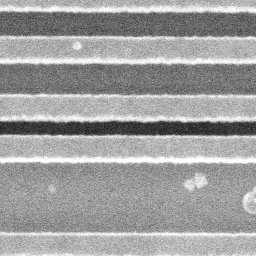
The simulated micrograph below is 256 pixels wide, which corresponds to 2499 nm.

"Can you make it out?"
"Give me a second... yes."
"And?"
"lines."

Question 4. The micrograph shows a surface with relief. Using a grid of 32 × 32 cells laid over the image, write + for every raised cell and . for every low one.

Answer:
++++++++++++++++++++++++++++++++
...............................+
................................
................................
................................
++++++++++++++++++++++++++++++++
++++++++++++++++++++++++++++++++
++++++++++++++++++++++++++++++++
................................
................................
................................
................................
++++++++++++++++++++++++++++++++
++++++++++++++++++++++++++++++++
++++++++++++++++++++++++++++++++
................................
................................
++++++++++++++++++++++++++++++++
++++++++++++++++++++++++++++++++
++++++++++++++++++++++++++++++++
................................
................................
................................
................................
................................
................................
................................
................................
................................
++++++++++++++++++++++++++++++++
++++++++++++++++++++++++++++++++
++++++++++++++++++++++++++++++++